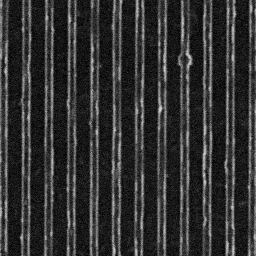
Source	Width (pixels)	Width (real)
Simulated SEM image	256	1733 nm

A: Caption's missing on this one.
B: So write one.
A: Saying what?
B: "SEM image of parallel lines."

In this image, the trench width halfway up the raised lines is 15.4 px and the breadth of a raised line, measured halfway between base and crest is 49.9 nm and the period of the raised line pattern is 22.7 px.